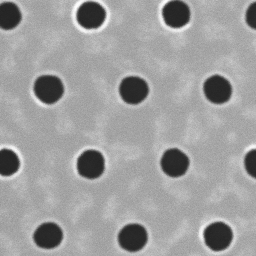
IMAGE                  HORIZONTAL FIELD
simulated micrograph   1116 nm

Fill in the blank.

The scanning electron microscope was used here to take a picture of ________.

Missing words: a regular array of holes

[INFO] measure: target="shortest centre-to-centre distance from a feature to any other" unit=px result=84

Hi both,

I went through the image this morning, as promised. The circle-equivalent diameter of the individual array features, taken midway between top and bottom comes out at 130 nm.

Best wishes